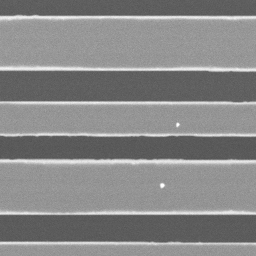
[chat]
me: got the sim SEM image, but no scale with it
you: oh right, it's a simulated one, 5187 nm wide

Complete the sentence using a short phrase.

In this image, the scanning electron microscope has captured lines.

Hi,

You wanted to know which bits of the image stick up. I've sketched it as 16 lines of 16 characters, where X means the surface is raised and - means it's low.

----------------
XXXXXXXXXXXXXXXX
XXXXXXXXXXXXXXXX
XXXXXXXXXXXXXXXX
----------------
----------------
XXXXXXXXXXXXXXXX
XXXXXXXXXXXXXXXX
----------------
----------------
XXXXXXXXXXXXXXXX
XXXXXXXXXXXXXXXX
XXXXXXXXXXXXXXXX
----------------
----------------
XXXXXXXXXXXXXXXX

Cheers